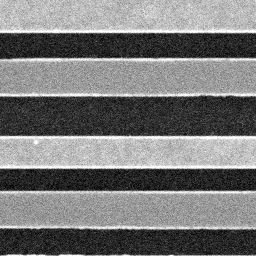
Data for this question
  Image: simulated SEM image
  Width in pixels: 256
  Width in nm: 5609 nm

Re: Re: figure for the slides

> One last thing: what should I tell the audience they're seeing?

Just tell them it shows lines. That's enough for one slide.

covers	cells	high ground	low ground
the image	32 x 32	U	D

UUUUUUUUUUUUUUUUUUUUUUUUUUUUUUUU
UUUUUUUUUUUUUUUUUUUUUUUUUUUUUUUU
UUUUUUUUUUUUUUUUUUUUUUUUUUUUUUUU
UUUUUUUUUUUUUUUUUUUUUUUUUUUUUUUU
DDDDDDDDDDDDDDDDDDDDDDDDDDDDDDDD
DDDDDDDDDDDDDDDDDDDDDDDDDDDDDDDD
DDDDDDDDDDDDDDDDDDDDDDDDDDDDDDDD
DDDDDDDDDUUDDDDDDDDDDDUUUUUUUUUU
UUUUUUUUUUUUUUUUUUUUUUUUUUUUUUUU
UUUUUUUUUUUUUUUUUUUUUUUUUUUUUUUU
UUUUUUUUUUUUUUUUUUUUUUUUUUUUUUUU
UUUUUUUUUUUUUUUUUUUUUUUUUUUUUUUU
DDDDDDDDDDDDDDDDDDDDDDDDDDDDDDDD
DDDDDDDDDDDDDDDDDDDDDDDDDDDDDDDD
DDDDDDDDDDDDDDDDDDDDDDDDDDDDDDDD
DDDDDDDDDDDDDDDDDDDDDDDDDDDDDDDD
DDDDDDDDDDDDDDDDDDDDDDDDDDDDDDDD
UUUUUUUUUUUUUUUUUUUUUUUUUUUUUUUU
UUUUUUUUUUUUUUUUUUUUUUUUUUUUUUUU
UUUUUUUUUUUUUUUUUUUUUUUUUUUUUUUU
UUUUUUUUUUUUUUUUUUUUUUUUUUUUUUUU
DDDDDDDDDDDDDDDDDDDDDDDDDDDDDDDD
DDDDDDDDDDDDDDDDDDDDDDDDDDDDDDDD
DDDDDDDDDDDDDDDDDDDDDDDDDDDDDDDD
UUUUUUUUUUUUUUUUUUUUUUUUUUUUUUUU
UUUUUUUUUUUUUUUUUUUUUUUUUUUUUUUU
UUUUUUUUUUUUUUUUUUUUUUUUUUUUUUUU
UUUUUUUUUUUUUUUUUUUUUUUUUUUUUUUU
DDDDDDDDDDDDDDDDDDUUUUUUUDUUUUUU
DDDDDDDDDDDDDDDDDDDDDDDDDDDDDDDD
DDDDDDDDDDDDDDDDDDDDDDDDDDDDDDDD
DDDDDDDDDDDDDDDDDDDDDDDDDDDDDDDD